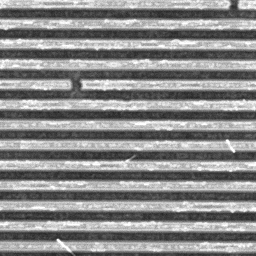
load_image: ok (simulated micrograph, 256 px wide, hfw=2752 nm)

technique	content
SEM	parallel lines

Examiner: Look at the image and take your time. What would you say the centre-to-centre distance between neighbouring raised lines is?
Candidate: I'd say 217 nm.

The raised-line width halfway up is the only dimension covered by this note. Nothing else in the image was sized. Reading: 0.102 um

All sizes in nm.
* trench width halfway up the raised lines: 121